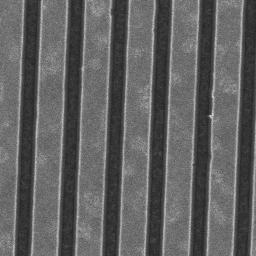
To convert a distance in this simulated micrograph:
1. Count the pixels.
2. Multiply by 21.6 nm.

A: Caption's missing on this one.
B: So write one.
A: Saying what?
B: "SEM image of parallel lines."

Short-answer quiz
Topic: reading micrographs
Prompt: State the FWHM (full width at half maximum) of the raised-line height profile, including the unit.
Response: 620 nanometres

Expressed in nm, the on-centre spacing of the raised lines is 945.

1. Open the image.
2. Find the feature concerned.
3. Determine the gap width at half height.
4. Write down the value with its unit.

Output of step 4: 329 nm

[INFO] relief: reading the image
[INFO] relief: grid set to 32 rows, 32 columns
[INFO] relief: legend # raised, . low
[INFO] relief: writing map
###..####..###..####..###..####.
###..####.####..###..####..###..
###..####.####..###..####..###..
###..####.####..###..####..###..
###..###..####..###..####..###..
###..###..####..###..####..###..
###..###..####..###..####..###..
###..###..####..###..####..###..
###..###..####..###..####..###..
###..###..####..###..####..###..
###..###..####..###..####..###..
###..###..####..###..####.####..
###..###..####..###..####.####..
###..###..###..####..###..####..
###..###..###..####..###..####..
###.####..###..####..###..####..
##..####..###..####..###..####..
##..####..###..####..###..####..
##..####..###..####..###..####..
##..####..###..####..###..####..
##..####..###..####..###..####..
##..####..###..####..###..####..
##..####..###..####..###..####..
##..####..###..####..###..####..
##..####..###..####..###..####..
##..####..###..####..###..####..
##..###...###..###..####..###..#
##..###...###..###..####..###..#
##..###...###..###..####..###..#
##..###..####..###..####..###..#
##..###..####..###..####..###..#
##..###..####..###..####..###..#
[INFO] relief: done